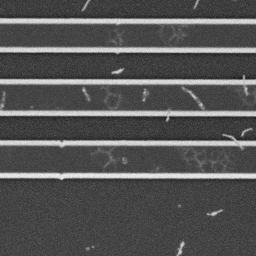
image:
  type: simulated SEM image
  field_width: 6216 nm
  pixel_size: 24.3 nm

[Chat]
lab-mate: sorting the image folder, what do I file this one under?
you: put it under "one or a few lines or trenches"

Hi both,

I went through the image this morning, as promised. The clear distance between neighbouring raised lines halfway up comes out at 750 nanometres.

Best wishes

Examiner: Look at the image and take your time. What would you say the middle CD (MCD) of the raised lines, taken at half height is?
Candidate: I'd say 762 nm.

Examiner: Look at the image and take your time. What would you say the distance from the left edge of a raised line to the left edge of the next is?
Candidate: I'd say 1500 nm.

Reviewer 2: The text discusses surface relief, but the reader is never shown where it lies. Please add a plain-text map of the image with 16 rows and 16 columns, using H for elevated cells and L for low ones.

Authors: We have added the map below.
LLLLLLLLLLLLLLLL
HHHHHHHHHHHHHHHH
HHHHHHHHHHHHHHHH
LLLLLLLLLLLLLLLL
LLLLLLLLLLLLLLLL
HHHHHHHHHHHHHHHH
HHHHHHHHHHHHHHHH
LLLLLLLLLLLLLLLL
LLLLLLLLLLLLLLLL
HHHHHHHHHHHHHHHH
HHHHHHHHHHHHHHHH
LLLLLLLLLLLLLLLL
LLLLLLLLLLLLLLLL
LLLLLLLLLLLLLLLL
LLLLLLLLLLLLLLLL
LLLLLLLLLLLLLLLL